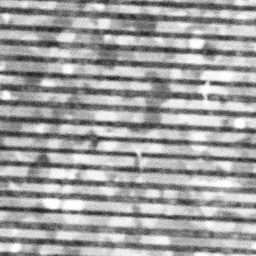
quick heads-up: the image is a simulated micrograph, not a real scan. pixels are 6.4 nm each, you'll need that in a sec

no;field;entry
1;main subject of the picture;parallel lines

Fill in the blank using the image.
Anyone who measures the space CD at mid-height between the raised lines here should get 48.8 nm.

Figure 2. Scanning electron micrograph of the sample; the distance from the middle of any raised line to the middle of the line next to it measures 0.0976 um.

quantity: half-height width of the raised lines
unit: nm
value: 49.6